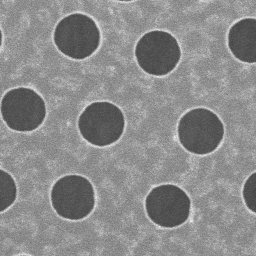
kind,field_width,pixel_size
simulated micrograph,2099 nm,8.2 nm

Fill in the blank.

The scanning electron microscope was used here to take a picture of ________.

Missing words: holes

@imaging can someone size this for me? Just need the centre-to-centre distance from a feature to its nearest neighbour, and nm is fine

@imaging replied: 669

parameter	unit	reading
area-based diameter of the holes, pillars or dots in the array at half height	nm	371